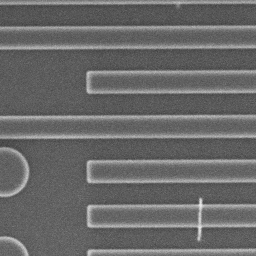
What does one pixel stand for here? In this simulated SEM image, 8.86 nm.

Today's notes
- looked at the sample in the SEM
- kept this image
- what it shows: groups of lines, slits or small figures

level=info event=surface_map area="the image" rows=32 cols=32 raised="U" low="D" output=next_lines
DDDDDDDDDDDDDDDDDDDDDDDDDDDDDDDD
DDDDDDDDDDDDDDDDDDDDDDDDDDDDDDDD
DDDDDDDDDDDDDDDDDDDDDDDDDDDDDDDD
UUUUUUUUUUUUUUUUUUUUUUUUUUUUUUUU
UUUUUUUUUUUUUUUUUUUUUUUUUUUUUUUU
UUUUUUUUUUUUUUUUUUUUUUUUUUUUUUUU
DDDDDDDDDDDDDDDDDDDDDDDDDDDDDDDD
DDDDDDDDDDDDDDDDDDDDDDDDDDDDDDDD
DDDDDDDDDDDDDDDDDDDDDDDDDDDDDDDD
DDDDDDDDDDDUUUUUUUUUUUUUUUUUUUUU
DDDDDDDDDDDUUUUUUUUUUUUUUUUUUUUU
DDDDDDDDDDDUUUUUUUUUUUUUUUUUUUUU
DDDDDDDDDDDDDDDDDDDDDDDDDDDDDDDD
DDDDDDDDDDDDDDDDDDDDDDDDDDDDDDDD
DDDDDDDDDDDDDUUUUUUUUUUUUUUUUUUU
UUUUUUUUUUUUUUUUUUUUUUUUUUUUUUUU
UUUUUUUUUUUUUUUUUUUUUUUUUUUUUUUU
DDDDDDDDDDDDDDDDDDDDDDDDDDDDDDDD
UDDDDDDDDDDDDDDDDDDDDDDDDDDDDDDD
UUUDDDDDDDDDDDDDDDDDDDDDDDDDDDDD
UUUDDDDDDDDUUUUUUUUUUUUUUUUUUUUU
UUUUDDDDDDDUUUUUUUUUUUUUUUUUUUUU
UUUDDDDDDDDUUUUUUUUUUUUUUUUUUUUU
UUUDDDDDDDDDDDDDDDDDDDDDDDDDDDDD
DDDDDDDDDDDDDDDDDDDDDDDDDDDDDDDD
DDDDDDDDDDDDDDDDDDDDDDDDDDDDDDDD
DDDDDDDDDDDUUUUUUUUUUUUUUUUUUUUU
DDDDDDDDDDDUUUUUUUUUUUUUUUUUUUUU
DDDDDDDDDDDDDDDDDDDDDDDDDDDDDDDD
DDDDDDDDDDDDDDDDDDDDDDDDDDDDDDDD
UUUDDDDDDDDDDDDDDDDDDDDDDDDDDDDD
UUUDDDDDDDDUUUUUUUUUUUUUUUUUUUUU